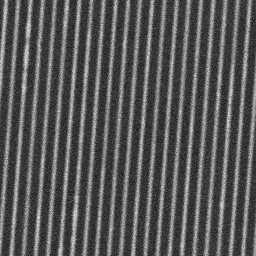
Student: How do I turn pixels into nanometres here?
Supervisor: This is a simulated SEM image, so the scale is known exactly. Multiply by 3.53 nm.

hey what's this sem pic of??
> parallel lines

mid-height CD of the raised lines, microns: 0.0088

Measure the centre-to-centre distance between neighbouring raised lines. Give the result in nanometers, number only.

42.9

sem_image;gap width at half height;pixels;9.32